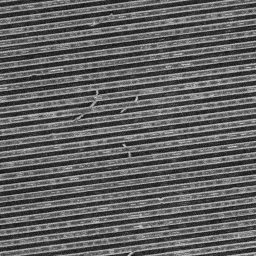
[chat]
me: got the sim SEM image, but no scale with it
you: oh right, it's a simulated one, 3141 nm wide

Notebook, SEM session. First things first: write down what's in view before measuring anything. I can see parallel lines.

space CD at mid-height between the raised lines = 0.0684 um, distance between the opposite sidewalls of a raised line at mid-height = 68.4 nm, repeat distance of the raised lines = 11 pixels